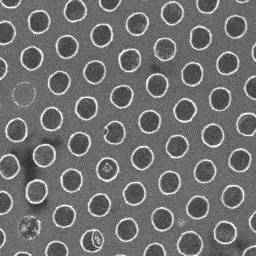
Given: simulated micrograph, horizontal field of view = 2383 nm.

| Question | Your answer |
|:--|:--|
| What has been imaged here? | a regular array of raised bodies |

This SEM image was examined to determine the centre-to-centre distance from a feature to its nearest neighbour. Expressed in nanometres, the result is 341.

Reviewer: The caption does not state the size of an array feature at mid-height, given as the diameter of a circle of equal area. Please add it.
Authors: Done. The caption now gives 209 nm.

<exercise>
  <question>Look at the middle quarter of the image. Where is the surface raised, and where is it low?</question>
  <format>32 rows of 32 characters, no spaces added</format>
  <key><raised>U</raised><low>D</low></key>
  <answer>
DDDDDUUUUUDDDDUUUUUDDDDDDDDDDDUU
DDDDDUUUUUDDDDDUUDDDDDDDDDDDDDUU
UDDDDUUUUUDDDDDDDDDDDDDDDDDDDDUU
UDDDDUUUUUDDDDDDDDDDDUUUUDDDDDUU
UDDDDDUUUDDDDDDDDDDDDUUUUUDDDDUU
UDDDDDDDDDDDDDUUDDDDDUUUUUDDDDDD
UDDDDDDDDDDDUUUUUDDDDUUUUUDDDDDD
DDDDDDDDDDDDUUUUUDDDDDUUUDDDDDDD
DDDDDUUDDDDDUUUUUDDDDDDDDDDDDDDD
DDDUUUUUDDDDUUUUUDDDDDDDDDDDDUUU
DDDUUUUUDDDDDUUUDDDDDDDDDDDDUUUU
DDDUUUUUDDDDDDDDDDDDDDDDDDDDUUUU
DDDUUUUUDDDDDDDDDDDDUUUUDDDDUUUU
DDDDUUUDDDDDDDDDDDDUUUUUDDDDUUUU
DDDDDDDDDDDDUUDDDDDUUUUUDDDDDDDD
DDDDDDDDDDDUUUUDDDDUUUUUDDDDDDDD
DDDDDDDDDDDUUUUDDDDUUUUDDDDDDDDD
DDUUUDDDDDUUUUUDDDDDDDDDDDDDDDDD
DDUUUUDDDDUUUUUDDDDDDDDDDDUUUUDD
DUUUUUDDDDDUUUDDDDDDDDDDDDUUUUUD
DUUUUUDDDDDDDDDDDDDDDDDDDDUUUUUD
DDUUUUDDDDDDDDDDDDUUUUDDDDUUUUUD
DDUUUDDDDDDDDDDDDUUUUUDDDDUUUUDD
DDDDDDDDDDDDDDDDDUUUUUDDDDDDDDDD
DDDDDDDDDUUUUDDDDUUUUUDDDDDDDDDD
DDDDDDDDUUUUUDDDDDUUUDDDDDDDDDDD
DUUDDDDDUUUUUUDDDDDDDDDDDDDDDDDD
UUUUDDDDUUUUUDDDDDDDDDDDDUUUDDDD
UUUUUDDDDUUUDDDDDDDDDDDDUUUUUDDD
UUUUDDDDDDDDDDDDDDDDDDDDUUUUUDDD
UUUUDDDDDDDDDDDDUUUUDDDDUUUUUDDD
UUUUDDDDDDDDDDDUUUUUDDDDUUUUDDDD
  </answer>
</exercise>